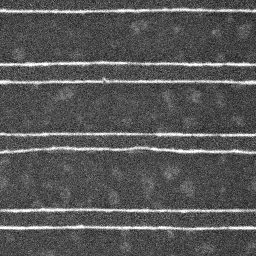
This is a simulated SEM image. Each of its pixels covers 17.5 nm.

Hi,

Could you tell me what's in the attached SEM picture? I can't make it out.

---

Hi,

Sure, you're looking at one or a few lines or trenches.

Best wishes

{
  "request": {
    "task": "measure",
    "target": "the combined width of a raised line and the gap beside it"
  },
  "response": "1.28 microns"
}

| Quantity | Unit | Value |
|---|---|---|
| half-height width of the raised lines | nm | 315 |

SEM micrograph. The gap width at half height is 0.931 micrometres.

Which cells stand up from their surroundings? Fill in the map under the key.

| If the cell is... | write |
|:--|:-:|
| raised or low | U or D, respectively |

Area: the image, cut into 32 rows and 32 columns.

UUUUUUUUUUUUUUUUUUUUUUUUUUUUUUUU
DDDDDDDDDDDDDDDDDDDDDDDDDDDDDDDD
DDDDDDDDDDDDDDDDDDDDDDDDDDDDDDDD
DDDDDDDDDDDDDDDDDDDDDDDDDDDDDDDD
DDDDDDDDDDDDDDDDDDDDDDDDDDDDDDDD
DDDDDDDDDDDDDDDDDDDDDDDDDDDDDDDD
DDDDDDDDDDDDDDDDDDDDDDDDDDDDDDDD
DDDDDDDDDDDDDDDDDDDDDDDDDDDDDDDD
UUUUUUUUUUUUUUUUUUUUUUUUUUUUUUUU
UUUUUUUUUUUUUUUUUUUUUUUUUUUUUUUU
DDDDDDDDDDDDDDDDDDDDDDDDDDDDDDDD
DDDDDDDDDDDDDDDDDDDDDDDDDDDDDDDD
DDDDDDDDDDDDDDDDDDDDDDDDDDDDDDDD
DDDDDDDDDDDDDDDDDDDDDDDDDDDDDDDD
DDDDDDDDDDDDDDDDDDDDDDDDDDDDDDDD
DDDDDDDDDDDDDDDDDDDDDDDDDDDDDDDD
DDDDDDDDDDDDDDDDDDDDDDDDDDDDDDDD
UUUUUUUUUUUUUUUUUUUUUUUUUUUUUUUU
UUUUUUUUUUUUUUUUUUUUUUUUUUUUUUUU
DDDDDDDDDDDDDDDDDDDDDDDDDDDDDDDD
DDDDDDDDDDDDDDDDDDDDDDDDDDDDDDDD
DDDDDDDDDDDDDDDDDDDDDDDDDDDDDDDD
DDDDDDDDDDDDDDDDDDDDDDDDDDDDDDDD
DDDDDDDDDDDDDDDDDDDDDDDDDDDDDDDD
DDDDDDDDDDDDDDDDDDDDDDDDDDDDDDDD
DDDDDDDDDDDDDDDDDDDDDDDDDDDDDDDD
UUUUUUUUUUUUUUUUUUUUUUUUUUUUUUUU
UUUUUUUUUUUUUUUUUUUUUUUUUUUUUUUU
UUUUUUDDDDDDDDDUDUUUDUUUUUUUUUUU
DDDDDDDDDDDDDDDDDDDDDDDDDDDDDDDD
DDDDDDDDDDDDDDDDDDDDDDDDDDDDDDDD
DDDDDDDDDDDDDDDDDDDDDDDDDDDDDDDD